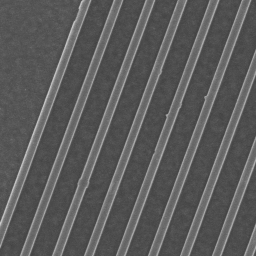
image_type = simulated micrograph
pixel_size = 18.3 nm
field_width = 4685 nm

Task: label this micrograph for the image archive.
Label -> parallel lines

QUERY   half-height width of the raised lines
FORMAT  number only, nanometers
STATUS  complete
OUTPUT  142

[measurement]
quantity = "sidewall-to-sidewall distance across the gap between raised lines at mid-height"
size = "408 nm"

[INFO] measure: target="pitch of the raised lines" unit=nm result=549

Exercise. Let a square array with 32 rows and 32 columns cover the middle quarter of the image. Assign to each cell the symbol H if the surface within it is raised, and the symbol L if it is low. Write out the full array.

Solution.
HLLLLLLHHLLLLLLHHLLLLLLHHLLLLLLH
LLLLLLHHLLLLLLHHLLLLLLHHLLLLLLHH
LLLLLLHHLLLLLLHHLLLLLLHHLLLLLLHH
LLLLLLHHLLLLLHHHLLLLLHHLLLLLLHHL
LLLLLHHLLLLLLHHLLLLLLHHLLLLLLHHL
LLLLLHHLLLLLLHHLLLLLLHHLLLLLLHHL
LLLLHHLLLLLLHHLLLLLLHHLLLLLLHHLL
LLLLHHLLLLLLHHLLLLLLHHLLLLLLHHLL
LLLLHHLLLLLLHHLLLLLLHHLLLLLLHHLL
LLLHHLLLLLLHHLLLLLLHHLLLLLLHHLLL
LLLHHLLLLLLHHLLLLLLHHLLLLLLHHLLL
LLLHHLLLLLLHHLLLLLLHHLLLLLLHHLLL
LLHHLLLLLLHHLLLLLLHHLLLLLLHHLLLL
LLHHLLLLLLHHLLLLLLHHLLLLLLHHLLLL
LHHLLLLLLHHLLLLLLHHLLLLLLHHLLLLL
LHHLLLLLLHHLLLLLLHHLLLLLLHHLLLLL
LHHLLLLLLHHLLLLLLHHLLLLLLHHLLLLL
HHLLLLLLHHLLLLLLHHLLLLLLHHLLLLLL
HHLLLLLLHHLLLLLLHHLLLLLLHHLLLLLL
HHLLLLLLHHLLLLLLHHLLLLLLHHLLLLLL
HLLLLLLHHLLLLLLHHLLLLLLHHLLLLLLH
HLLLLLLHHLLLLLLHHLLLLLLHHLLLLLLH
HLLLLLLHHLLLLLHHHLLLLLLHLLLLLLHH
LLLLLLHHLLLLLLHHLLLLLLHHLLLLLLHH
LLLLLLHHLLLLLLHHLLLLLLHHLLLLLLHH
LLLLLHHLLLLLLHHLLLLLLHHLLLLLLHHL
LLLLLHHLLLLLLHHLLLLLLHHLLLLLLHHL
LLLLLHHLLLLLLHHLLLLLLHHLLLLLLHHL
LLLLHHLLLLLLHHLLLLLLHHLLLLLLHHLL
LLLLHHLLLLLLHHLLLLLLHHLLLLLLHHLL
LLLLHHLLLLLLHHLLLLLLHHLLLLLLHHLL
LLLHHLLLLLLHHLLLLLLHHLLLLLLHHLLL